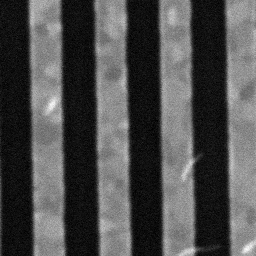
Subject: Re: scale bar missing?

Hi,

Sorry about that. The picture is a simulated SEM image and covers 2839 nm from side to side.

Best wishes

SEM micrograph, lines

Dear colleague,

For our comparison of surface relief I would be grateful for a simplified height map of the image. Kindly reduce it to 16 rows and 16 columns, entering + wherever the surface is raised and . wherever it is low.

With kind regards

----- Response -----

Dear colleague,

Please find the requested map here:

..++..++..++..++
..++..++..++..++
..++..++..++..++
..++..++..++..++
..++..++..++..++
..++..++..++..++
..++..++..++..++
..++..++..++..++
..++..++..++..++
..++..++..++..++
..++..++..++..++
..++..++..++..++
..++..++..++..++
..++..++..++..++
..++..++..++..++
..++..++..++..++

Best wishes